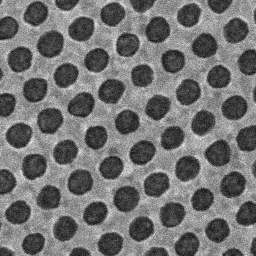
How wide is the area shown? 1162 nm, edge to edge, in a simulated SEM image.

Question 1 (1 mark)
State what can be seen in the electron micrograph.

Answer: a regular array of holes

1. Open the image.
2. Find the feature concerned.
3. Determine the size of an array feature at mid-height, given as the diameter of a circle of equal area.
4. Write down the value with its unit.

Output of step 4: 119 nanometres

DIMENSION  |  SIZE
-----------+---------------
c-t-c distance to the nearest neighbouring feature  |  154 nanometres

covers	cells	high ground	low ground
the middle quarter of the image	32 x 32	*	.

...**......*******....**......**
....**....*******.....***....***
....*************......****.****
....*************......*********
...*******.....**.....*******...
..*******......***...********...
*********......*************....
***....*.......********.****....
**.....**.....*******.....**....
*.......**....*******......**...
*.......************.......*****
*......********..***......******
*......******.....**......******
*************......**....*******
*************......*************
*******..****......*******...***
******.....**.....*******.....**
*****......***..********......**
*****......*************......**
...**......*******....**......**
...***....*******......*.....***
....************.......***.*****
...*************.......*********
...*******....**......*******...
..*******......**....*******....
*********......***.*********....
***...***......*************....
**.....**.....*******.....**....
*......***...*******......**....
*......*************.......***.*
*......********..***.......*****
*......******......*......******